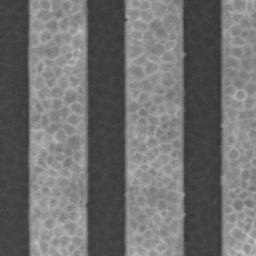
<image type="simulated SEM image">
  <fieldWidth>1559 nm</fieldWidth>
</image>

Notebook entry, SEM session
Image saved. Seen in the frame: one or a few lines or trenches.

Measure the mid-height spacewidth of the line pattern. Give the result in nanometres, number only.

248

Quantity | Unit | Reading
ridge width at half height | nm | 340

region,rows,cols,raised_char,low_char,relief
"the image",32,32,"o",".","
....ooooooo.....ooooooo.....oooo
....ooooooo.....ooooooo.....oooo
....ooooooo.....ooooooo.....oooo
....ooooooo.....ooooooo.....oooo
....ooooooo.....ooooooo.....oooo
....ooooooo.....ooooooo.....oooo
....ooooooo.....ooooooo.....oooo
....ooooooo.....ooooooo.....oooo
....ooooooo.....ooooooo.....oooo
....ooooooo.....ooooooo.....oooo
....ooooooo.....ooooooo.....oooo
....ooooooo.....ooooooo.....oooo
....ooooooo.....ooooooo.....oooo
....ooooooo.....ooooooo.....oooo
....ooooooo.....ooooooo.....oooo
....ooooooo.....ooooooo.....oooo
....ooooooo.....ooooooo.....oooo
....ooooooo.....ooooooo.....oooo
....ooooooo.....ooooooo.....oooo
....ooooooo.....ooooooo.....oooo
....ooooooo.....ooooooo.....oooo
....ooooooo.....ooooooo.....oooo
....ooooooo.....ooooooo.....oooo
....ooooooo.....ooooooo.....oooo
....ooooooo.....ooooooo.....oooo
....ooooooo.....ooooooo.....oooo
....ooooooo.....ooooooo.....oooo
....ooooooo.....ooooooo.....oooo
....ooooooo.....ooooooo.....oooo
....ooooooo.....ooooooo.....oooo
....ooooooo.....ooooooo.....oooo
....ooooooo.....ooooooo.....oooo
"